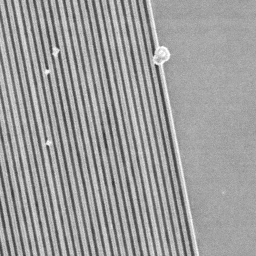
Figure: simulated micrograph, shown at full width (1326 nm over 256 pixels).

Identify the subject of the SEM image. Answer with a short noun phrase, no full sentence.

parallel lines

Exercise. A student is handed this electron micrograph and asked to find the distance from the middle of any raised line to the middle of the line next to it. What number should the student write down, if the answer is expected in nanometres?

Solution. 37.3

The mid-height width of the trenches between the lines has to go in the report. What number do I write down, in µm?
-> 0.0197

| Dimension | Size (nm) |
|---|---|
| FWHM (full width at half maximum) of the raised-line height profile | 19.7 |